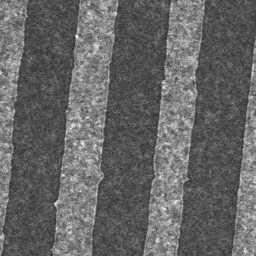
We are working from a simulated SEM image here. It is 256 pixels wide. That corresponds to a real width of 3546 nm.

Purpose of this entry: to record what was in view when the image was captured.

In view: one or a few lines or trenches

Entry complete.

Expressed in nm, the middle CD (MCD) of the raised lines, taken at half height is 460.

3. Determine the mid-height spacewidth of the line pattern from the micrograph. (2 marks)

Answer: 747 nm